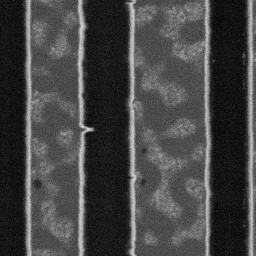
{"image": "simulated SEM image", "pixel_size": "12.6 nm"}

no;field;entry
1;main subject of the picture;one or a few lines or trenches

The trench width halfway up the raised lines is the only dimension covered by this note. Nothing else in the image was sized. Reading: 0.572 micrometres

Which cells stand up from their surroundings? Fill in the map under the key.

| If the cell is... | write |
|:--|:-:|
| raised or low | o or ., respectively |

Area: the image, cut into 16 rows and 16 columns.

..ooo...ooooo...
..ooo...ooooo...
..ooo...ooooo...
..ooo...ooooo...
..ooo...ooooo...
..ooo...ooooo...
..ooo...ooooo...
..ooo...ooooo...
..ooo...ooooo...
..ooo...ooooo...
..ooo...ooooo...
..ooo...ooooo...
..ooo...ooooo...
..ooo...ooooo...
..ooo...ooooo...
..ooo...ooooo...